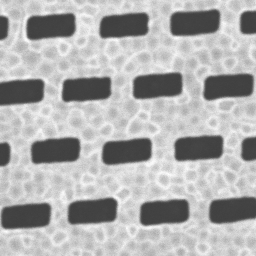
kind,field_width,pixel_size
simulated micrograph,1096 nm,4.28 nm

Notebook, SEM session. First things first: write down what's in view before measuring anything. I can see a regular array of holes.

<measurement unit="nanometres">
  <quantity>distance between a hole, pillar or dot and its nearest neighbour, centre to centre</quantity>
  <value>293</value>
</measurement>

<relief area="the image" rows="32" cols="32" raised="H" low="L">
HHHHHHHHHHHHHHHHHHHHHHHHHHHHHHHH
HHHHHHHHHHHHHHHHHHHHHHLLLLLHHHHL
LHHLLLLLLHHHHLLLLLLHHLLLLLLLHHLL
LHHLLLLLLHHHLLLLLLLHHLLLLLLHHHLL
LHHLLLLLLHHHHLLLLLHHHHLHHHHHHHHH
HHHHHHHHHHHHHHHHHHHHHHHHHHHHHHHH
HHHHHHHHHHHHHHHHHHHHHHHHHHHHHHHH
HHHHHHHHHHHHHHHHHHHHHHHHHHHHHHHH
HHHHHHHHHHHHHHHHHHHHHHHHHHHHHHHH
HHHHHHHHHHHHHHHHHLLLLLLHHHLLLLLH
LLLLLHHHLLLLLLHHHLLLLLLHHLLLLLLL
LLLLLLHHLLLLLLHHHLLLLLLHHLLLLLLL
LLLLLHHHLLLLLHHHHHHHHHHHHHLHHHHH
HHHHHHHHHHHHHHHHHHHHHHHHHHHHHHHH
HHHHHHHHHHHHHHHHHHHHHHHHHHHHHHHH
HHHHHHHHHHHHHHHHHHHHHHHHHHHHHHHH
HHHHHHHHHHHHHHHHHHHHHHHHHHHHHHHH
HHHHHHLLLLHHHHHHLLLHHHLLLLLLHHLL
LHHHLLLLLLHHHLLLLLLHHHLLLLLLHHLL
LHHHLLLLLLHHHLLLLLLHHHLLLLLLHHLL
LHHHHHHHHHHHHLLHHHHHHHHHHHHHHHHH
HHHHHHHHHHHHHHHHHHHHHHHHHHHHHHHH
HHHHHHHHHHHHHHHHHHHHHHHHHHHHHHHH
HHHHHHHHHHHHHHHHHHHHHHHHHHHHHHHH
HHHHHHHHHHHHHHHHHHHHHHHHHHHHHHHH
HHHLLLHHHLLLLLLHHHLLLLLLHHLLLLLL
LLLLLLHHLLLLLLLHHLLLLLLLHHLLLLLL
LLLLLLHHHLLLLLHHHLLLLLLHHHLLLLLH
LLLHHHHHHHHHHHHHHHHHHHHHHHHHHHHH
HHHHHHHHHHHHHHHHHHHHHHHHHHHHHHHH
HHHHHHHHHHHHHHHHHHHHHHHHHHHHHHHH
HHHHHHHHHHHHHHHHHHHHHHHHHHHHHHHH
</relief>